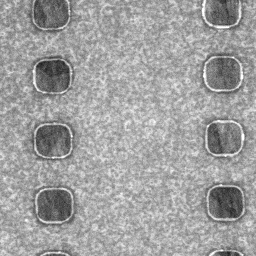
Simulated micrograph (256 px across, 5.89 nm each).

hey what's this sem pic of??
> raised bodies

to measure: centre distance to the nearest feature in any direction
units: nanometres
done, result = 379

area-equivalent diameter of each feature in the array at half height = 222 nm